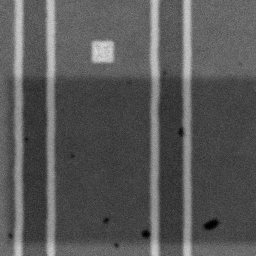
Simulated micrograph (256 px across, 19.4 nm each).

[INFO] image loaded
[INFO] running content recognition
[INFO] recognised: wiring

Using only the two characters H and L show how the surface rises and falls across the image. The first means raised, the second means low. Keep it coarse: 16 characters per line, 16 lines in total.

HLLHHHHHHHLLHHHH
HLLHHHHHHHLLHHHH
HLLHHHHHHHLLHHHH
HLLHHHLHHHLLHHHH
HLLHHHHHHHLLHHHH
HLLHHHHHHHLLHHHH
HLLHHHHHHHLLHHHH
HLLHHHHHHHLLHHHH
HLLHHHHHHHLLHHHH
HLLHHHHHHHLLHHHH
HLLHHHHHHHLLHHHH
HLLHHHHHHHLLHHHH
HLLHHHHHHHLLHHHH
HLLHHHHHHHLLHHHH
HLLHHHHHHHLLHHHH
HLLHHHHHHHLLHHHH